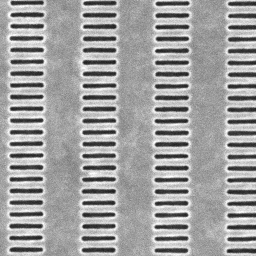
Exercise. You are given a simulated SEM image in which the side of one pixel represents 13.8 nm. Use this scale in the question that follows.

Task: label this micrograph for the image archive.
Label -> a regular array of holes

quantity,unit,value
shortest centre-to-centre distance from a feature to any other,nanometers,160